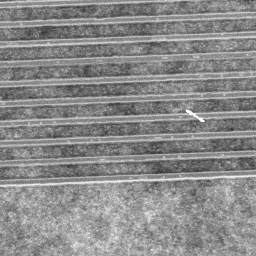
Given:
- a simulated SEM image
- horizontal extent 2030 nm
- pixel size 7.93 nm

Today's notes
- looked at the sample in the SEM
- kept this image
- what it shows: parallel lines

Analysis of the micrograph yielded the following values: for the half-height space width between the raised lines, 117 nm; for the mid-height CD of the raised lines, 39.6 nm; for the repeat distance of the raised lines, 157 nm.